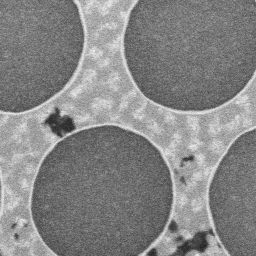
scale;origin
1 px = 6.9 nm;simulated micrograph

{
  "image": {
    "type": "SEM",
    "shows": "holes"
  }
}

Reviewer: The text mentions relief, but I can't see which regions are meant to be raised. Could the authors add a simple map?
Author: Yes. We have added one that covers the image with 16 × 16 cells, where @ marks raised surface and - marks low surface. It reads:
-----@@@--------
-----@@@--------
-----@@@--------
-----@@@--------
-----@@@--------
----@@@@@------@
---@@@@@@@----@@
@@@@@@@@@@@@@@@@
@@@@-----@@@@@@-
@@@-------@@@@--
@@---------@@---
@@---------@@---
@@---------@@---
@@---------@@---
@@--------@@@---
@@@------@@@@@--